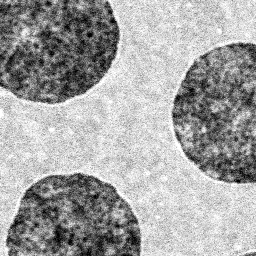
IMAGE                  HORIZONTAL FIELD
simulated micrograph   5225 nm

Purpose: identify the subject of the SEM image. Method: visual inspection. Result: holes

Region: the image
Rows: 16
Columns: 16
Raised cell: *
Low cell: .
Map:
.......*********
.......*********
.......*********
.......*****....
.......*****....
......*****.....
***.*******.....
***********.....
***********.....
***********.....
************....
**.....*********
*.......********
*.......********
.........*******
.........*******